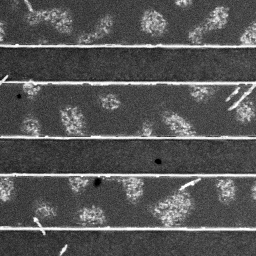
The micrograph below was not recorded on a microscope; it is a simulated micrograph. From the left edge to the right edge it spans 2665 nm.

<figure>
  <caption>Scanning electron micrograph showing one or a few lines or trenches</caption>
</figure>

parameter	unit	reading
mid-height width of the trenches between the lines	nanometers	378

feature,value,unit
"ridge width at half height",0.57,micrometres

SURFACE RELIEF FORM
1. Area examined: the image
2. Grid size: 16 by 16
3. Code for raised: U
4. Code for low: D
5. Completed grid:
UUUUUUUUUUUUUUUU
UUUUUUUUUUUUUUUU
UUUUUUUUUUUUUUUU
DDDDDDDDDDDDDDDD
DDDDDDDDDDDDDDDD
UUUUUUUUUUUUUUUU
UUUUUUUUUUUUUUUU
UUUUUUUUUUUUUUUU
UUUUUUUUUUUUUUUU
DDDDDDDDDDDDDDDD
DDDDDDDDDDDDDDDD
UUUUUUUUUUUUUUUU
UUUUUUUUUUUUUUUU
UUUUUUUUUUUUUUUU
DDDDDDDDDDDDDDDD
DDDDDDDDDDDDDDDD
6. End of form